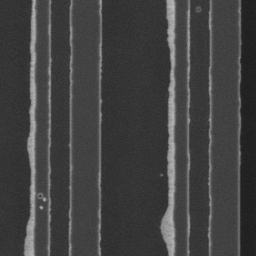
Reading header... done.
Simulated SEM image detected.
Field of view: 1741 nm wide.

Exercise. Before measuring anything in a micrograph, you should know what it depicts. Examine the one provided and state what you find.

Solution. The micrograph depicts lines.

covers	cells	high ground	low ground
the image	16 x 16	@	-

--@@@@-----@@@@-
--@@@@-----@@@@-
--@@@@-----@@@@-
--@@@@-----@@@@-
--@@@@-----@@@@-
--@@@@-----@@@@-
--@@@@-----@@@@-
--@@@@-----@@@@-
--@@@@-----@@@@-
--@@@@-----@@@@-
--@@@@-----@@@@-
--@@@@-----@@@@-
--@@@@-----@@@@-
--@@@@-----@@@@-
--@@@@-----@@@@-
--@@@@-----@@@@-